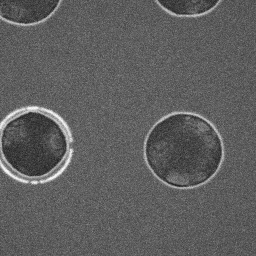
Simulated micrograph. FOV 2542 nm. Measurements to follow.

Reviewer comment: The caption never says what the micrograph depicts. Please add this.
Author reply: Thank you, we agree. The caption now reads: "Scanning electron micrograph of holes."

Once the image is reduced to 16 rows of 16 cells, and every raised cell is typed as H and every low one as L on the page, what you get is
LLLHHHHHHHLLLHHH
HHHHHHHHHHHHHHHH
HHHHHHHHHHHHHHHH
HHHHHHHHHHHHHHHH
HHHHHHHHHHHHHHHH
HHHHHHHHHHHHHHHH
HHHHHHHHHHHHHHHH
HLLHHHHHHHLLLHHH
LLLLHHHHHLLLLLHH
LLLLHHHHHLLLLLHH
HLLHHHHHHLLLLLHH
HHHHHHHHHHHLHHHH
HHHHHHHHHHHHHHHH
HHHHHHHHHHHHHHHH
HHHHHHHHHHHHHHHH
HHHHHHHHHHHHHHHH